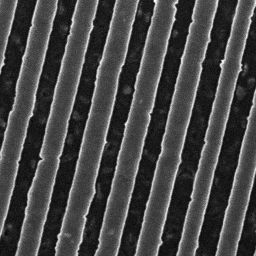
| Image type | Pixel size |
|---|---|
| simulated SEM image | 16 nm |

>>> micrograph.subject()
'parallel lines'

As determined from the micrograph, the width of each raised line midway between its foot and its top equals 327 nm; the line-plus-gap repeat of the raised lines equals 0.62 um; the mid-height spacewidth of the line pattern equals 18.6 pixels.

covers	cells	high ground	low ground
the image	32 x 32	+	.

++...++...++..+++..+++..+++...++
++..+++..+++..+++..+++..+++..+++
++..+++..+++..+++..+++..+++..++.
+...++...+++..++...++...++...++.
+...++...++..+++..+++..+++...++.
+..+++..+++..+++..+++..+++..+++.
+..+++..+++..+++..+++..+++..++..
+..++...+++..+++..++...++...++..
...++...++..+++..+++...++...++..
..+++..+++..+++..+++..+++...++..
..+++..+++..+++..+++..+++..++...
..+++..+++..+++..++...+++..++...
..++...++...++...++...++...++...
..++..+++..+++..+++..+++...++..+
.+++..+++..+++..+++..+++..+++..+
.++...++...+++..+++..+++..++...+
.++...++...++...++...++...++...+
+++..+++..+++..+++..+++...++..++
+++..+++..+++..+++..+++..+++..++
+++..+++..+++..+++..+++..++...++
++...++...++...++...++...++...++
++...++..+++..+++..+++...++..+++
++..+++..+++..+++..+++..+++..+++
++..+++..+++..+++..+++..++...++.
+..+++...+++..++...++...++...++.
+..+++..+++..+++..+++...++...++.
+..+++..+++..+++..+++..+++..+++.
+..+++..+++..+++..+++..++...++..
...++...++...++...++...++...++..
...++..+++..+++..+++...++...++..
..+++..+++..+++..+++..+++..+++..
..+++..+++..+++..+++..++...+++..